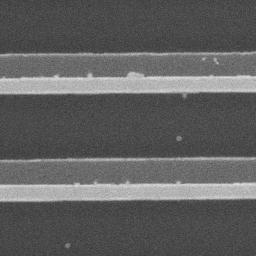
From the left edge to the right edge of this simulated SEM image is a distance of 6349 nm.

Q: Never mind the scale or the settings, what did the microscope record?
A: lines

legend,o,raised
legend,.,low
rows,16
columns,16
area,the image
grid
................
................
................
oooooooooooooooo
oooooooooooooooo
oooooooooooooooo
................
................
................
................
oooooooooooooooo
oooooooooooooooo
................
................
................
................